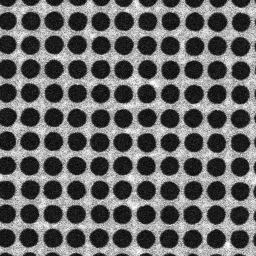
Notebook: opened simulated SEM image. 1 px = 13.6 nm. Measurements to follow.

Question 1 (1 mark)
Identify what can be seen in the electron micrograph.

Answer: a regular array of holes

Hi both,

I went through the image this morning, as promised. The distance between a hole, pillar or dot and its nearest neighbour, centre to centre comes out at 314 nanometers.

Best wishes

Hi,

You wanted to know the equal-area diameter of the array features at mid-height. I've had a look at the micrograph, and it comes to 264 nanometres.